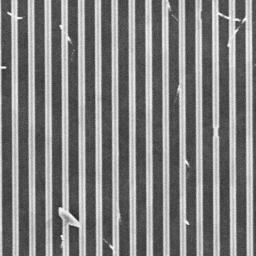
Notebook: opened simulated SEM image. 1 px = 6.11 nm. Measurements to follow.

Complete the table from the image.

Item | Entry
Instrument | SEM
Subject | parallel lines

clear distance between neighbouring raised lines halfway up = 11.7 pixels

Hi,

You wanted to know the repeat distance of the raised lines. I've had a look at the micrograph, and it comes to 102 nanometers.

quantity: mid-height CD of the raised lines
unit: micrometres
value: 0.0275